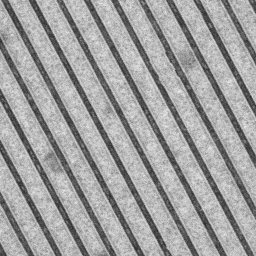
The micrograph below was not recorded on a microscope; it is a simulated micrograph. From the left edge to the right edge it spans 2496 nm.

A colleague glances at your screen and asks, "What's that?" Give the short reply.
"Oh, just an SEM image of parallel lines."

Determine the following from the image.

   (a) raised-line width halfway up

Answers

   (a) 164 nanometres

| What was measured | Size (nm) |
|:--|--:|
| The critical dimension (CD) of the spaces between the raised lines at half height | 77.5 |